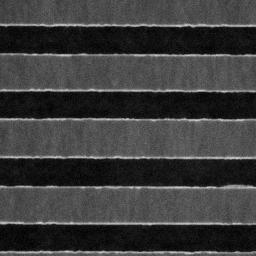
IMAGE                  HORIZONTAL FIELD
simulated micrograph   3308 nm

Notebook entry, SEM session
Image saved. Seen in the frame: lines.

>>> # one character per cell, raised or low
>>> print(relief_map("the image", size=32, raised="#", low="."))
################################
################################
################################
................................
................................
................................
................................
################################
################################
################################
################################
................................
................................
................................
................................
################################
################################
################################
################################
################################
................................
................................
................................
################################
################################
################################
################################
################################
................................
................................
................................
###########################..#.#